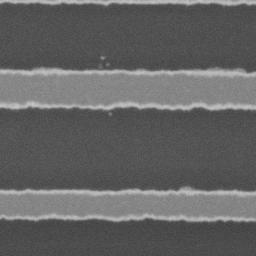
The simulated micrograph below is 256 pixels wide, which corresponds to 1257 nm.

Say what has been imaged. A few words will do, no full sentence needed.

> lines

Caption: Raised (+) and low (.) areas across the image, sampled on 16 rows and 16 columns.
................
................
................
................
++++++++++++++..
++++++++++++++++
++++++++++++++++
................
................
................
................
................
++++++++++++++++
++++++++++++++++
................
................